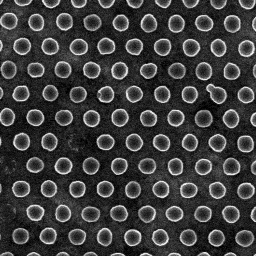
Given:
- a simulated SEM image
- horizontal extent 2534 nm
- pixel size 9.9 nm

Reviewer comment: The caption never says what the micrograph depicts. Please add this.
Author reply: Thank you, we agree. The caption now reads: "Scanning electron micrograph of a regular array of raised bodies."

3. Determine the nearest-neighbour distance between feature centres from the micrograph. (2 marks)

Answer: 27.2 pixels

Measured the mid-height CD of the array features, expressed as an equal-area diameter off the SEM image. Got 166 nm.